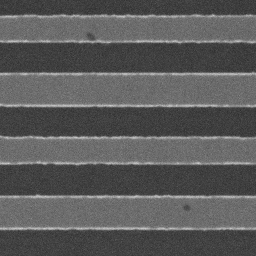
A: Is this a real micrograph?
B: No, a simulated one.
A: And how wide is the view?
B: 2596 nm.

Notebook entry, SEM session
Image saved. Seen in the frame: lines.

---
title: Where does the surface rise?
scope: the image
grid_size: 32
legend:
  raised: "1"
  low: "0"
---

00000000000000000000000000000000
00000000000000000000000000000000
11111111111111111111111111111111
11111111111111111111111111111111
11111111111111111111111111111111
00000000000000000000000000000000
00000000000000000000000000000000
00000000000000000000000000000000
00000000000000000000000000000000
11111111111111111111111111111111
11111111111111111111111111111111
11111111111111111111111111111111
11111111111111111111111111111111
00000000000000000000000000000000
00000000000000000000000000000000
00000000000000000000000000000000
00000000000000000000000000000000
11111111111111111111111111111111
11111111111111111111111111111111
11111111111111111111111111111111
00000000010000000000000000000000
00000000000000000000000000000000
00000000000000000000000000000000
00000000000000000000000000000000
00001000000001000101110000000000
11111111111111111111111111111111
11111111111111111111111111111111
11111111111111111111111111111111
11111111111111111111111111111111
00000000000000000000000000000000
00000000000000000000000000000000
00000000000000000000000000000000